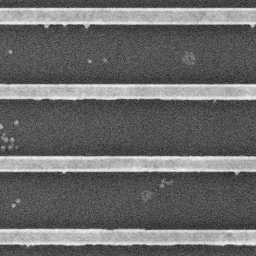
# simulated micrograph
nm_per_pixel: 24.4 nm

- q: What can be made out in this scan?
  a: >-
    lines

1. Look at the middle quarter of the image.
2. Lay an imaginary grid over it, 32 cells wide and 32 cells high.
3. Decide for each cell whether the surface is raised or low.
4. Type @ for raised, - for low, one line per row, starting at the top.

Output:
--------------------------------
--------------------------------
--------------------------------
--------------------------------
--------------------------------
@@@@@@@@@@@@@@@@@@@@@@@@@@@@@@@@
@@@@@@@@@@@@@@@@@@@@@@@@@@@@@@@@
@@@@@@@@@@@@@@@@@@@@@@@@@@@@@@@@
@@@@@@@@@@@@@@@@@@@@@@@@@@@@@@@@
--------------------------------
--------------------------------
--------------------------------
--------------------------------
--------------------------------
--------------------------------
--------------------------------
--------------------------------
--------------------------------
--------------------------------
--------------------------------
--------------------------------
--------------------------------
--------------------------------
@@@@@@@@@@@@@@@@@@@@@@@@@@@@@@@@
@@@@@@@@@@@@@@@@@@@@@@@@@@@@@@@@
@@@@@@@@@@@@@@@@@@@@@@@@@@@@@@@@
@@@@@@@@@@@@@@@@@@@@@@@@@@@@@@@@
--------------------------------
--------------------------------
--------------------------------
--------------------------------
--------------------------------